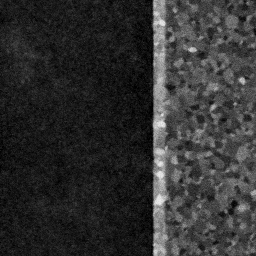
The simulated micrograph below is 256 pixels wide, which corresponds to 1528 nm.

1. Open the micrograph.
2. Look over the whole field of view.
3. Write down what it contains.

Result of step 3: one or a few lines or trenches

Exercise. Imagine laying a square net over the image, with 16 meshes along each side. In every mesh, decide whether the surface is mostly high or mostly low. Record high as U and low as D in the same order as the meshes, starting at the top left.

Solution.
DDDDDDDDDDUUUUUU
DDDDDDDDDDUUUUUU
DDDDDDDDDDUUUUUU
DDDDDDDDDDUUUUUU
DDDDDDDDDDUUUUUU
DDDDDDDDDDUUUUUU
DDDDDDDDDDUUUUUU
DDDDDDDDDDUUUUUU
DDDDDDDDDDUUUUUU
DDDDDDDDDDUUUUUU
DDDDDDDDDDUUUUUU
DDDDDDDDDDUUUUUU
DDDDDDDDDDUUUUUU
DDDDDDDDDDUUUUUU
DDDDDDDDDDUUUUUU
DDDDDDDDDDUUUUUU